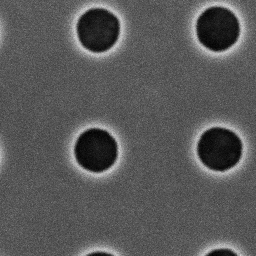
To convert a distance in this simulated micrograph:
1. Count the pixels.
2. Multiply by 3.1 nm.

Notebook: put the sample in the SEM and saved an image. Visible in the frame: holes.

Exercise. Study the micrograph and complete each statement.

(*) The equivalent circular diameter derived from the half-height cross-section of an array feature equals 139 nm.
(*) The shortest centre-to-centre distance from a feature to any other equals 372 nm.